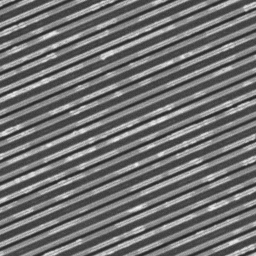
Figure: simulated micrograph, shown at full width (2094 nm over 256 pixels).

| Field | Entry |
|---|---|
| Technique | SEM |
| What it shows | parallel lines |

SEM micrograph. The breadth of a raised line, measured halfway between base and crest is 34.7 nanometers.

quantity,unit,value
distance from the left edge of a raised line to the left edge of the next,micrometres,0.0824